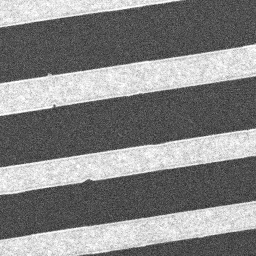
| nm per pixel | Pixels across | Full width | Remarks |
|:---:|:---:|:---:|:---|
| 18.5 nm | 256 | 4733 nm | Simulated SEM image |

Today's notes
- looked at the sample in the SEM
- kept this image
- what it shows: one or a few lines or trenches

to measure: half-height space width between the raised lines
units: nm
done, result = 982